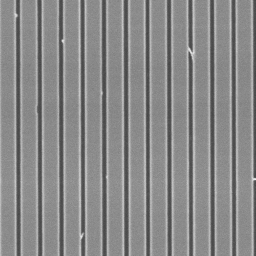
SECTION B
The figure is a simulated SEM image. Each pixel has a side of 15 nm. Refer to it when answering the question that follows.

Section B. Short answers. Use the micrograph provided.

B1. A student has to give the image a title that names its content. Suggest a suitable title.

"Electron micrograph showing parallel lines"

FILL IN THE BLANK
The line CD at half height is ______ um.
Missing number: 0.254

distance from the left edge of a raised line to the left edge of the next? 324 nanometers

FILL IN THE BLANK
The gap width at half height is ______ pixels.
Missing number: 5